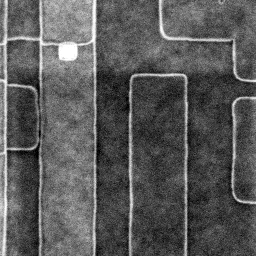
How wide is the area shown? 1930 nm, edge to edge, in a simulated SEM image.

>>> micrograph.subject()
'wiring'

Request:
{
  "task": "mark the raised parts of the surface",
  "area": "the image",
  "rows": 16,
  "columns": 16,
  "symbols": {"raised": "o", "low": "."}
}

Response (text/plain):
oooooo....oooooo
oooooo....oooooo
o.oooo......oooo
...ooo.........o
...ooo.........o
oooooo..oooo....
oooooo..oooo...o
oooooo..oooo...o
oooooo..oooo...o
o.oooo..oooo...o
..oooo..oooo...o
..oooo..oooo...o
..oooo..oooo...o
..oooo..oooo....
..oooo..oooo....
..oooo..oooo....